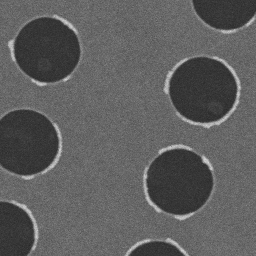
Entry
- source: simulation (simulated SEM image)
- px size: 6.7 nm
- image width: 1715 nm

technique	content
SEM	holes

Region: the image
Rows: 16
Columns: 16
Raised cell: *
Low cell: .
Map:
************....
**..*********..*
*....***********
*....***********
**..*******...**
***********....*
***********....*
...*********..**
....************
....******..****
...******....***
*********....***
**********...***
..**************
..**************
..*******..*****